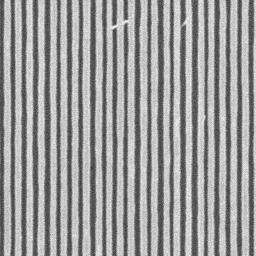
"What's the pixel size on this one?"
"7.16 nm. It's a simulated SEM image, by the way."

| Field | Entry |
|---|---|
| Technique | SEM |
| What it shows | parallel lines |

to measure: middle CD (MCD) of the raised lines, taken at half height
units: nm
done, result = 41.1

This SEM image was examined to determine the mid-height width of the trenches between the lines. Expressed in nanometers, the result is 41.1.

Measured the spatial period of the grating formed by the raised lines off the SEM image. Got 81 nm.